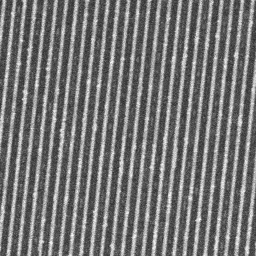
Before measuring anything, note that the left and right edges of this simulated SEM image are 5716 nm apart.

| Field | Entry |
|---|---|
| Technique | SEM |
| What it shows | parallel lines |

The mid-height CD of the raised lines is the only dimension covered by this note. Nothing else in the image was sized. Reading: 63.8 nanometres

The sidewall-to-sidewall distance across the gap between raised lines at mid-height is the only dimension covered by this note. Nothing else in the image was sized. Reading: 175 nm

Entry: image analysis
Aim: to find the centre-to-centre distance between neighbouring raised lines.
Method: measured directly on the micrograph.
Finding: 10.3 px